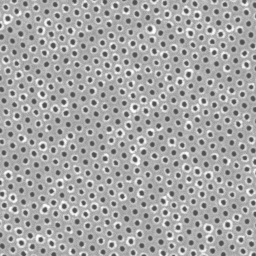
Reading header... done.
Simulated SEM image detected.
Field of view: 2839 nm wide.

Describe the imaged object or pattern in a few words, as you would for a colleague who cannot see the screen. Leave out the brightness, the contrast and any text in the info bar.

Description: a regular array of holes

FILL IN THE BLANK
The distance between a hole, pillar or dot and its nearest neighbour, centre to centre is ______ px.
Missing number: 11.1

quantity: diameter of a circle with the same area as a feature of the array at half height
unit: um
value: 0.06